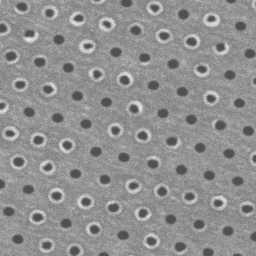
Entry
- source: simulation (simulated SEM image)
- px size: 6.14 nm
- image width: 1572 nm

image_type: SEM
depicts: a regular array of holes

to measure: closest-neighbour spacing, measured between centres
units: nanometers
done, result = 176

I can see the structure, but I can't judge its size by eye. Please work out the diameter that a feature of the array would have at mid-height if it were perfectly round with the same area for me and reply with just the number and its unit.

0.0616 micrometres